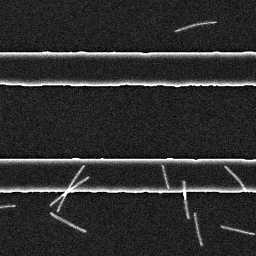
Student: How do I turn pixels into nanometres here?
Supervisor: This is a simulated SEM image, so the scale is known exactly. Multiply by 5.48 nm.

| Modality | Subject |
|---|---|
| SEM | lines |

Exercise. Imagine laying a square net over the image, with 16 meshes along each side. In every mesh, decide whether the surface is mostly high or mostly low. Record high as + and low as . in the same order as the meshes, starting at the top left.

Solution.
................
................
................
++++++++++++++++
++++++++++++++++
................
................
................
................
................
++++++++++++++++
++++++++++++++++
................
................
................
................